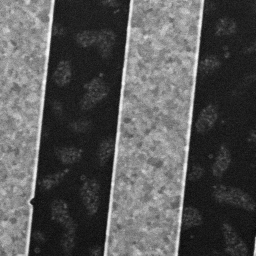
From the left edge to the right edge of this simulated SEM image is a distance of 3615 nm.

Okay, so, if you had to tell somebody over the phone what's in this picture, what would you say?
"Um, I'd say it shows one or a few lines or trenches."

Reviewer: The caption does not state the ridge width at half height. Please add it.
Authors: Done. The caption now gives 1010 nanometers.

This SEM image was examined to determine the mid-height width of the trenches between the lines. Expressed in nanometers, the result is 1100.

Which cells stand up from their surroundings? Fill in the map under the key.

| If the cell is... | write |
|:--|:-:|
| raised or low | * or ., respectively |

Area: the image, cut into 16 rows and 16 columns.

***.....*****...
***.....*****...
***.....****....
***.....****....
***.....****....
***.....****....
***.....****....
***....*****....
**.....*****....
**.....*****....
**.....*****....
**.....*****....
**.....****.....
**.....****.....
**.....****.....
**.....****.....